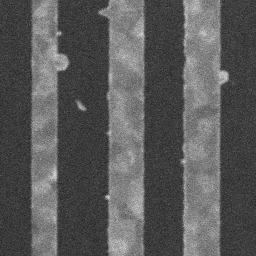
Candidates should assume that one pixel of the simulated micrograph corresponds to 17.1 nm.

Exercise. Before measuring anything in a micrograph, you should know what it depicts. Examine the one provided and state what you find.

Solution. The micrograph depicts one or a few lines or trenches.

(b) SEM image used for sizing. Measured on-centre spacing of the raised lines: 1350 nm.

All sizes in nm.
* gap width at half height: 719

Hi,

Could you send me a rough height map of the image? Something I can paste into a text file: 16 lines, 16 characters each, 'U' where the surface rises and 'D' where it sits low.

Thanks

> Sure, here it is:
DDUUDDDUUDDDUUDD
DDUUDDDUUDDDUUDD
DDUUDDDUUDDDUUDD
DDUUDDDUUDDDUUDD
DDUUDDDUUDDDUUDD
DDUUDDDUUDDDUUDD
DDUUDDDUUDDDUUDD
DDUUDDDUUDDDUUDD
DDUUDDDUUDDDUUDD
DDUUDDDUUDDDUUDD
DDUUDDDUUDDDUUDD
DDUUDDDUUDDDUUDD
DDUUDDDUUDDDUUDD
DDUDDDDUUDDDUUDD
DDUUDDDUUDDDUUDD
DDUUDDDUUDDDUUDD